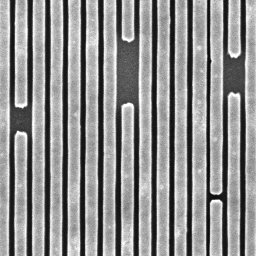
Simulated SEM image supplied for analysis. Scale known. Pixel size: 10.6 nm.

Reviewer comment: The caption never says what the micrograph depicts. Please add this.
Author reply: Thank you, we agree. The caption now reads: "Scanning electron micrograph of parallel lines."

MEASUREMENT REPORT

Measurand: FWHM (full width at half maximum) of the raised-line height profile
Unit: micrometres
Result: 0.137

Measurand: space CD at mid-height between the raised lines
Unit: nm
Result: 50.2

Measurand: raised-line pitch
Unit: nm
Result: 188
